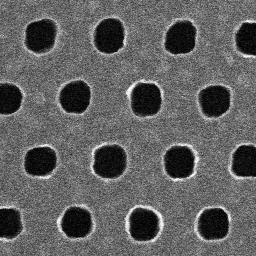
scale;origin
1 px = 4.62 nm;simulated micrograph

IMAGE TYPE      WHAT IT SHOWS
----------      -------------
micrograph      a regular array of holes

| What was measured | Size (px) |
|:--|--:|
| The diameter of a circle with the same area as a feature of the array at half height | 31.7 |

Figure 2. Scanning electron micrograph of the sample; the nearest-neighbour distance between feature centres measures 319 nm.